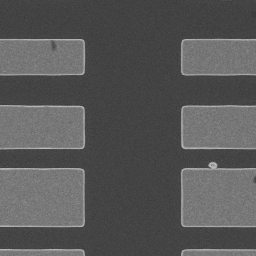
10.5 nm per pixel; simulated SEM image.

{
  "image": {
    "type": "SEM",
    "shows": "groups of lines, slits or small figures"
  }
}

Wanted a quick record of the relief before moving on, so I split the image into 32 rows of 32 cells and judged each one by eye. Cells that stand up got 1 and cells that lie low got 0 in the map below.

00000000000000000000000000000000
00000000000000000000000000000000
00000000000000000000000000000000
00000000000000000000000000000000
00000000000000000000000000000000
11111111111000000000000111111111
11111111111000000000000111111111
11111111111000000000000111111111
11111111111000000000000111111111
00000000000000000000000000000000
00000000000000000000000000000000
00000000000000000000000000000000
00000000000000000000000000000000
11111111110000000000000111111111
11111111111000000000000111111111
11111111111000000000000111111111
11111111111000000000000111111111
11111111111000000000000111111111
11111111110000000000000111111111
00000000000000000000000000000000
00000000000000000000000000000000
11111111110000000000000111111111
11111111111000000000000111111111
11111111111000000000000111111111
11111111110000000000000111111111
11111111111000000000000111111111
11111111111000000000000111111111
11111111111000000000000111111111
00000000000000000000000000000000
00000000000000000000000000000000
00000000000000000000000000000000
11111111110000000000000111111111